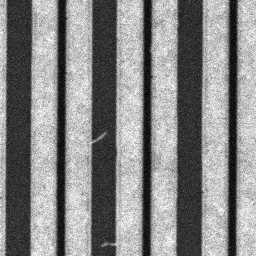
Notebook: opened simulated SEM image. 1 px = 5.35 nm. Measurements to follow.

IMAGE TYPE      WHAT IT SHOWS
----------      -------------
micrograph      parallel lines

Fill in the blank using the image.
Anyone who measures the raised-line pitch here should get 229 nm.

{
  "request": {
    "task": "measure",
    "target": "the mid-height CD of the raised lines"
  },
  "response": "134 nanometres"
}